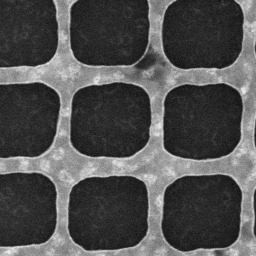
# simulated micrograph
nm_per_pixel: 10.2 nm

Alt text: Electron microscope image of holes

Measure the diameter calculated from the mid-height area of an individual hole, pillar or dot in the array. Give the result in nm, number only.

846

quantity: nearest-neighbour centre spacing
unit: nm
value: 934